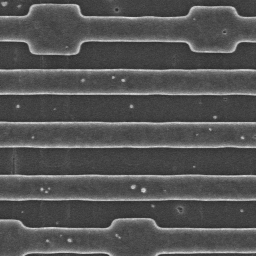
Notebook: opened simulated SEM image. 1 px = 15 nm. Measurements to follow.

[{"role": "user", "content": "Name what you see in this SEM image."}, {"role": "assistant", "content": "wiring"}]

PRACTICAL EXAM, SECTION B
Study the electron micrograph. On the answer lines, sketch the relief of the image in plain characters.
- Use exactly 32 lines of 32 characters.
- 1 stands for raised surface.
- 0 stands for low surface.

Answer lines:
00000000000000000000000000000000
00001111110000000000000011111100
11111111111111111111111111111111
11111111111111111111111111111111
11111111111111111111111111111111
00011111110000000000000111111100
00001111110000000000000000000000
00000000000000000000000000000000
00000000000000000000000000000000
11111111111111111111111111111111
11111111111111111111111111111111
11111111111111111111111111111111
00000000000000000000000000000000
00000000000000000000000000000000
00000000000000000000000000000000
11111111111111111111111111111111
11111111111111111111111111111111
11111111111111111111111111111111
00000000000000000000000000000000
00000000000000000000000000000000
00000000000000000000000000000000
00000000000000000000000000000000
11111111111111111111111111111111
11111111111111111111111111111111
11111111111111111111111111111111
00000000000000000000000000000000
00000000000000000000000000000000
00000000000000011110000000000000
11110000000001111111000000000000
11111111111111111111111111111111
11111111111111111111111111111111
11111111111111111111111111111111